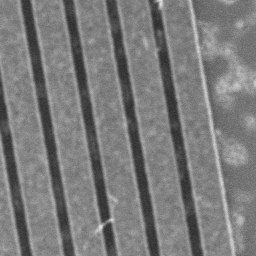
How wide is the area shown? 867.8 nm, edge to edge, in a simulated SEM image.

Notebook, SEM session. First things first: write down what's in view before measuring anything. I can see parallel lines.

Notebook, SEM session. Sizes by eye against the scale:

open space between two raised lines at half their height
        0.0435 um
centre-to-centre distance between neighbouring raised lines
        42.2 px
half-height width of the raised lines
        101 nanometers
